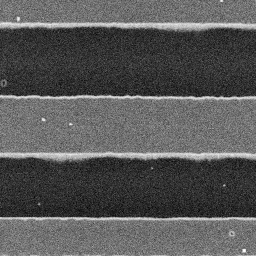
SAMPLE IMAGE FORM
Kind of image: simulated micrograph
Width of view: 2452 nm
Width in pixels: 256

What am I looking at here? lines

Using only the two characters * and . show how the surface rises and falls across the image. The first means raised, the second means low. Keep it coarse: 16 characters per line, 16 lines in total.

****************
****************
................
................
................
................
****************
****************
****************
****************
................
................
................
................
****************
****************